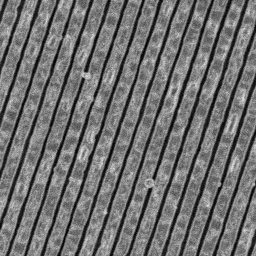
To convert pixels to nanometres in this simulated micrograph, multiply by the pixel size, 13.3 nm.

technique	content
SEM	parallel lines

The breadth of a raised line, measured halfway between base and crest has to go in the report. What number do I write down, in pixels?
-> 12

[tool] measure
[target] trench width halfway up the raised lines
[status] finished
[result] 60 nanometers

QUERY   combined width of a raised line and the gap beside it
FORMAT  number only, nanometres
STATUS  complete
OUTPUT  217